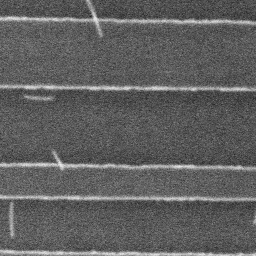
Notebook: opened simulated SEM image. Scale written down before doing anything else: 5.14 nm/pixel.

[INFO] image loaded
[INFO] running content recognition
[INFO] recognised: lines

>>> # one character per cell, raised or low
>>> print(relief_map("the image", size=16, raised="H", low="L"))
LLLLLLLLLLLLLLLL
HHHHHHHHHHHHHHHH
HHHHHHHHHHHHHHHH
HHHHHHHHHHHHHHHH
HHHHHHHHHHHHHHHH
LLLLLHHHHHHHHHHH
LLLLLLLLLLLLLLLL
LLLLLLLLLLLLLLLL
LLLLLLLLLLLLLLLL
LLLLLLLLLLLLLLLL
HHHHHHHHHHHHHHHH
HHHHHHHHHHHHHHHH
LLLLLLLLLLLLLLLL
LLLLLLLLLLLLLLLL
LLLLLLLLLLLLLLLL
LLLLLLLLLLLLLLLL